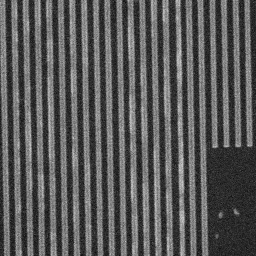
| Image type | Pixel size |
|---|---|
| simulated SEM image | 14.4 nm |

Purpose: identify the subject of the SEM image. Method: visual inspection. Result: parallel lines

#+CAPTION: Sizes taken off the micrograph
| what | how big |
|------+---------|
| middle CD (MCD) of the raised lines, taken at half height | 70.4 nanometres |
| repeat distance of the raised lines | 168 nanometres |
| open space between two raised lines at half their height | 99.3 nm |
